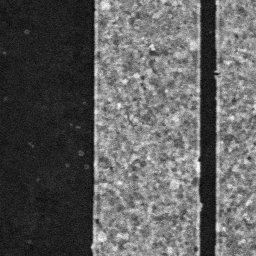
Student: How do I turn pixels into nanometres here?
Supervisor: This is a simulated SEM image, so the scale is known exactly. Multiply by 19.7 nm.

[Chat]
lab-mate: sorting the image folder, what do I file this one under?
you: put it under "one or a few lines or trenches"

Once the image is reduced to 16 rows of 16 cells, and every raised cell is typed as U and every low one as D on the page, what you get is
DDDDDDUUUUUUDDUU
DDDDDDUUUUUUDDUU
DDDDDDUUUUUUDDUU
DDDDDDUUUUUUDDUU
DDDDDDUUUUUUDDUU
DDDDDDUUUUUUDDUU
DDDDDDUUUUUUDDUU
DDDDDDUUUUUUDDUU
DDDDDDUUUUUUDDUU
DDDDDDUUUUUUDDUU
DDDDDDUUUUUUDDUU
DDDDDDUUUUUUDDUU
DDDDDDUUUUUUDDUU
DDDDDDUUUUUUDDUU
DDDDDDUUUUUUDDUU
DDDDDDUUUUUUDDUU